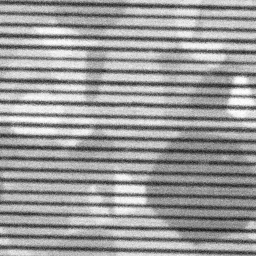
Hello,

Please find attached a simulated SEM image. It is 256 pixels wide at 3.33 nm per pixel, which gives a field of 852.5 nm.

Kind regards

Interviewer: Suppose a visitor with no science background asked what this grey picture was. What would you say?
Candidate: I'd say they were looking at parallel lines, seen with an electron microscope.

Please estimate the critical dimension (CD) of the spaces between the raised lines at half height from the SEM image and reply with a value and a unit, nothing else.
0.0196 µm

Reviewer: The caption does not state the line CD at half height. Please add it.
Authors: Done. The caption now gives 19.2 nanometres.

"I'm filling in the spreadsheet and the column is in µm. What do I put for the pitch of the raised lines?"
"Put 0.037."